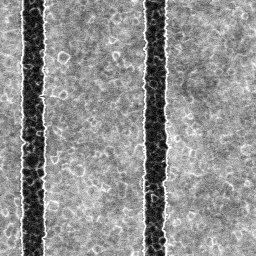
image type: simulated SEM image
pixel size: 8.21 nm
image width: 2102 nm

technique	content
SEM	one or a few lines or trenches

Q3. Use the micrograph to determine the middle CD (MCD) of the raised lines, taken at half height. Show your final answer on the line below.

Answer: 22.1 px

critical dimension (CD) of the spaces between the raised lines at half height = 810 nanometers